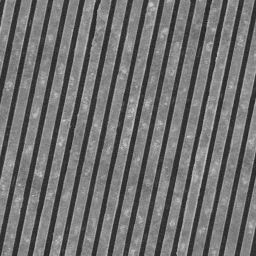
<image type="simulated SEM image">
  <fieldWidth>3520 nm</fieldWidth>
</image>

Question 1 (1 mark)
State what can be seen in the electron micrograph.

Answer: parallel lines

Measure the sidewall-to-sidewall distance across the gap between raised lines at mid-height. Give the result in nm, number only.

77.5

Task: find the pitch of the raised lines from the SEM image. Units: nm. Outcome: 214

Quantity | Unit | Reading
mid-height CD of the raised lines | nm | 140